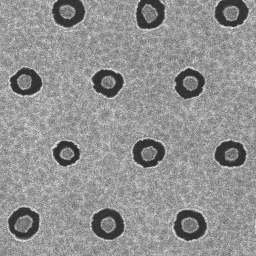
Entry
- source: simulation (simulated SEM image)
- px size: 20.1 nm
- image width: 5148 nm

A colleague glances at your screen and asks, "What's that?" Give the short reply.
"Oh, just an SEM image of a regular array of ring-shaped grooves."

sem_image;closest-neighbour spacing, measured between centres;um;1.63